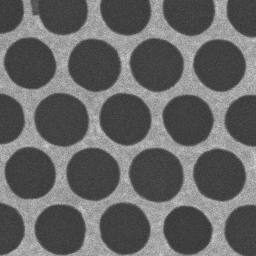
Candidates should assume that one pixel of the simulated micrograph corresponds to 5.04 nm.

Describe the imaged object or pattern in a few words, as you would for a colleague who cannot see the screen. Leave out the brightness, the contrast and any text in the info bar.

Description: a regular array of holes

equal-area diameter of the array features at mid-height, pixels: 52.3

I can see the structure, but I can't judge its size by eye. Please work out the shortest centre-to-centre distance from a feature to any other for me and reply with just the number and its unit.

315 nm